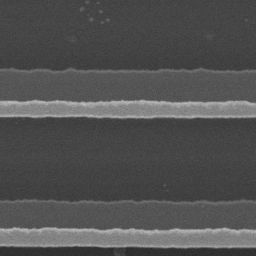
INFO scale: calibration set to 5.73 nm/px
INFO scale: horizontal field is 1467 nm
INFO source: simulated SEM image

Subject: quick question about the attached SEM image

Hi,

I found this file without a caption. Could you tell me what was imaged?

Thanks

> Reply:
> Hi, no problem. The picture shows lines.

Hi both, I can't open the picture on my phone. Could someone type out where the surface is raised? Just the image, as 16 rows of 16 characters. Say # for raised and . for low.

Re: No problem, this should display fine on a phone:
................
................
................
................
################
################
################
................
................
................
................
................
................
################
################
................